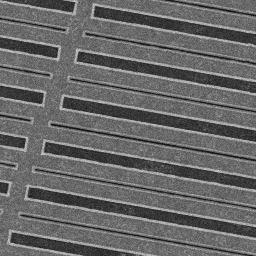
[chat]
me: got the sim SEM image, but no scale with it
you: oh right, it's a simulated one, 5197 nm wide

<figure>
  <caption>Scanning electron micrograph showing parallel lines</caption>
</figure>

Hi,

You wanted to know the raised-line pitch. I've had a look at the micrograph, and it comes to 0.483 micrometres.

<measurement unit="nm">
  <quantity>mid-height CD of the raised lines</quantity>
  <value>297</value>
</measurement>